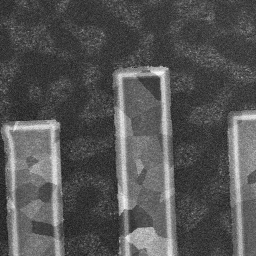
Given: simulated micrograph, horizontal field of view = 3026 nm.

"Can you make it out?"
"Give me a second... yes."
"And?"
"one or a few lines or trenches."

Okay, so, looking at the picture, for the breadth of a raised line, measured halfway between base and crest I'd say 490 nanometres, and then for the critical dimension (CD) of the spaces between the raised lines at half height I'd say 831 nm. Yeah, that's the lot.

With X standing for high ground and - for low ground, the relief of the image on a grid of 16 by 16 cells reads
----------------
----------------
----------------
----------------
----------------
--------XX------
--------XX------
--------XX-----X
-XX-----XX-----X
-XX-----XX-----X
-XX-----XX-----X
-XX-----XX-----X
-XX-----XXX----X
-XX-----XXX----X
-XXX----XXX----X
-XXX----XXX----X